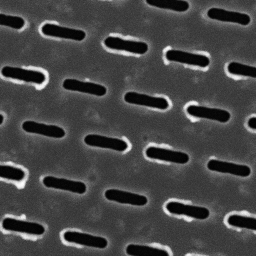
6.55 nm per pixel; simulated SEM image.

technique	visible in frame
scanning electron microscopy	a regular array of holes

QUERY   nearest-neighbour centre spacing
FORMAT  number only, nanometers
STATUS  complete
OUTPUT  384